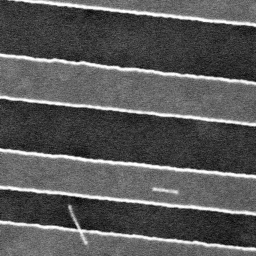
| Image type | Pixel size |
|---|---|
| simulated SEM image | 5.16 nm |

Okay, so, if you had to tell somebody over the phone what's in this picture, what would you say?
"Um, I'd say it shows lines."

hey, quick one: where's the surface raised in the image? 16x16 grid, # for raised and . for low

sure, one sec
.....###########
...............#
................
#...............
##########......
################
...#############
.............###
................
#...............
###########.....
################
.......#########
................
######..........
###############.